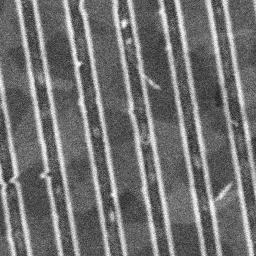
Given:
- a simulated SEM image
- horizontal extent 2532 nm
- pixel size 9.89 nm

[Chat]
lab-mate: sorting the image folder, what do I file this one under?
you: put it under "parallel lines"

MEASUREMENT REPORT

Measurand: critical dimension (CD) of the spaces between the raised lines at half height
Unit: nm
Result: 157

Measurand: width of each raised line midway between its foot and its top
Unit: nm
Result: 307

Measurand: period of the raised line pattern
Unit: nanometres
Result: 464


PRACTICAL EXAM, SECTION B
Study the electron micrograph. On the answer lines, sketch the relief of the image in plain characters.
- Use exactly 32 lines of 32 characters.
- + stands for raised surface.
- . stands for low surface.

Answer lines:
++..++++..++++..++++..++++..++++
+++.++++..++++..++++..++++..++++
+++..++++..++++..++++..++++.++++
+++..++++..++++..++++..++++..+++
+++..++++..++++..++++..++++..+++
+++..++++..++++..++++..++++..+++
+++..++++..++++..++++..++++..+++
++++..++++..+++..++++..++++..+++
++++..++++..++++..++++.++++..+++
++++..++++..++++..++++..++++..++
++++..++++..++++..++++..++++..++
++++..++++..++++..++++..++++..++
++++..++++..++++..++++..++++..++
.++++..+++...+++...+++..++++..++
.++++..++++..++++..++++..++++.++
.++++..++++..++++..++++..++++..+
.++++..++++..++++..++++..++++..+
.++++..++++..++++..++++..++++..+
.+++++.++++..++++..++++..++++..+
..++++..++++..+++..++++..++++..+
..++++..++++..++++..++++..++++.+
..++++..++++..++++..++++..++++..
..++++..++++..++++..++++..++++..
..++++..++++..++++..++++..++++..
+.++++..++++..++++..++++..++++..
+..++++..++++..+++...+++..++++..
+..++++..++++..++++..++++..++++.
+..++++..++++..++++..++++..++++.
+..++++..++++..++++..++++..++++.
+..++++..++++..++++..++++..++++.
+..++++..++++..++++..++++..++++.
++..++++..+++...+++..++++..++++.